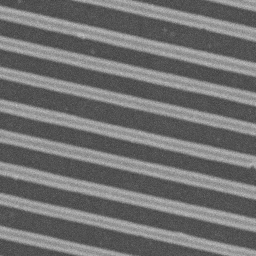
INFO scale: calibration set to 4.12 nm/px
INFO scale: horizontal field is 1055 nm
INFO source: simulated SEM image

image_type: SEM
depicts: parallel lines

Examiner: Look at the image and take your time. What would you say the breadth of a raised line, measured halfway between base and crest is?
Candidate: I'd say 0.0388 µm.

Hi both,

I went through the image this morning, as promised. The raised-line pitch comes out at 127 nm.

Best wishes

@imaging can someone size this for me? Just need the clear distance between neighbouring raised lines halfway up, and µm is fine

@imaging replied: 0.0851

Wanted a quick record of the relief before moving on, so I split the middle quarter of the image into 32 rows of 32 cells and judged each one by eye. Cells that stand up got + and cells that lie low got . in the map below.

....++++++++++++................
.........+++++++++++............
..............+++++++++++.......
...................++++++++++...
.......................+++++++++
++++........................++++
++++++++........................
..+++++++++++...................
.......++++++++++...............
...........+++++++++++..........
................++++++++++......
....................+++++++++++.
.........................+++++++
+++..........................+++
+++++++.........................
..+++++++++.....................
......+++++++++++...............
...........++++++++++...........
...............+++++++++........
....................++++++++++..
+.......................++++++++
++++++......................++++
++++++++++......................
...++++++++++++.................
........+++++++++++.............
............++++++++++++........
.................+++++++++++....
.....................+++++++++++
..........................++++++
++++..........................++
++++++++++......................
...++++++++++...................